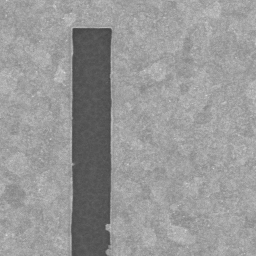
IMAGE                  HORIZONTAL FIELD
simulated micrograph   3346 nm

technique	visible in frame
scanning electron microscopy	one or a few lines or trenches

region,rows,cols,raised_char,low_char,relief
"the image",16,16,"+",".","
++++++++++++++++
++++++++++++++++
+++++..+++++++++
+++++..+++++++++
++++...+++++++++
++++...+++++++++
++++...+++++++++
+++++..+++++++++
++++...+++++++++
++++...+++++++++
+++++..+++++++++
+++++..+++++++++
+++++..+++++++++
+++++..+++++++++
++++...+++++++++
++++...+++++++++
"